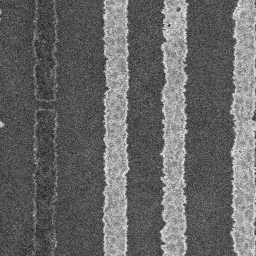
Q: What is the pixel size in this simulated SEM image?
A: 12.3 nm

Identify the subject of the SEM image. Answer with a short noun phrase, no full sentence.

one or a few lines or trenches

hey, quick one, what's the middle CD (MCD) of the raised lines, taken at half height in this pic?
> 237 nanometres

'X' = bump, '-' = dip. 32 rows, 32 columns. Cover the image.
-----XX------XXX-----XX-------XX
-----XX------XXX-----XX------XXX
-----XX------XXX-----XX------XXX
-----XX------XXX-----XX-------XX
----XXX------XXX-----XX------XXX
----XXX------XXX-----XX-------XX
----XXX------XXX----XXX------XXX
-----XX------XXX-----XX-------XX
----XXX------XXX-----XX------XXX
----XXX------XXX-----XX------XXX
-----XX------XXX-----XX-------XX
-----XX------XXX----XXX------XXX
-----XX------XXX----XXX------XXX
-------------XXX-----XX------XXX
----XXX------XXX-----XX------XX-
----XXX------XXX-----XX-------XX
----XXX------XXX-----XX------XXX
----XXX------XXX-----XX------XXX
----XXX------XXX-----XX------XXX
----XXX------XXX-----XX------XXX
-----XX------XXX-----XX------XXX
----XXX------XXX-----XX------XXX
----XXX------XXX-----XX------XXX
----XXX------XXX-----XX------XXX
----XXX------XXX-----XX------XXX
----XXX------XXX----XXX------XXX
----XXX------XXX----XXX------XXX
----XXX------XXX-----XX------XXX
----XXX------XXX-----XX------XXX
----XXX------XXX----XXX------XXX
----XXX------XXX-----XX------XXX
----XXX------XXX-----XX-------XX